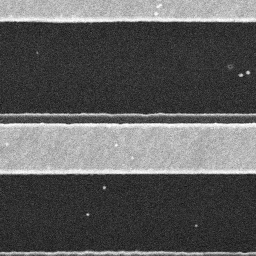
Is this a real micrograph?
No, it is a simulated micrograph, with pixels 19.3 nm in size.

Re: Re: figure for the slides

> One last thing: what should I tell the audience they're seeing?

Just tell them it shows lines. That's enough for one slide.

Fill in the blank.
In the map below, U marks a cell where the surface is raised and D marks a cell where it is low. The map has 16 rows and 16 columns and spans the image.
UUUUUUUUUUUUUUUU
DDDDDDDDDDDDDDDD
DDDDDDDDDDDDDDDD
DDDDDDDDDDDDDDDD
DDDDDDDDDDDDDDDD
DDDDDDDDDDDDDDDD
DDDDDDDDDDDDDDDD
UUUUUUUUUUUUUUUU
UUUUUUUUUUUUUUUU
UUUUUUUUUUUUUUUU
UUUUUUUUUUUUUUUU
DDDDDDDDDDDDDDDD
DDDDDDDDDDDDDDDD
DDDDDDDDDDDDDDDD
DDDDDDDDDDDDDDDD
DDDDDDDDDDDDDDDD